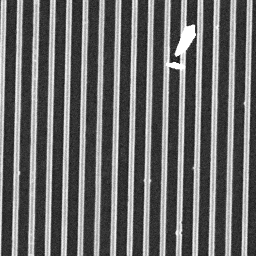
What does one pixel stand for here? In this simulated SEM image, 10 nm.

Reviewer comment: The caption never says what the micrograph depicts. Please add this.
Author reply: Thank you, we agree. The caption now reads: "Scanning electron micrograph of parallel lines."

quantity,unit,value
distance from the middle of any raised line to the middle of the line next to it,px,16.4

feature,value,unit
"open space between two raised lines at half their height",0.125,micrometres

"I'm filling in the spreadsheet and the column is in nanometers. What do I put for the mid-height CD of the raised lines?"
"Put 45.1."